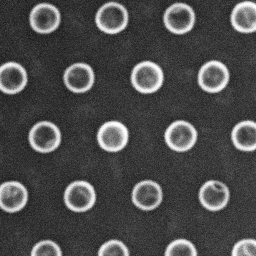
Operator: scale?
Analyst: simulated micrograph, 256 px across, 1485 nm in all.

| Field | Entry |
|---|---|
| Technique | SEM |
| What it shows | a regular array of raised bodies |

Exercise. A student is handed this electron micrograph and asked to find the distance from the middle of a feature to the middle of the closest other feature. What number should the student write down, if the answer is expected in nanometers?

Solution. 390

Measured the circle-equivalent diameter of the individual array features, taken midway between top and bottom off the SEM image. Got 164 nm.